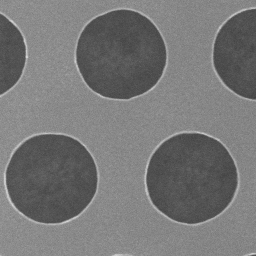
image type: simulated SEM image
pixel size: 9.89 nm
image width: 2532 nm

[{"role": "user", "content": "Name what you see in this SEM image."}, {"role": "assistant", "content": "holes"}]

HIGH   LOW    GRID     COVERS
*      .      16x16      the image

****************
.*****....****..
.****.....***...
..***.....***...
.****.....****..
.*****...*****..
****************
****************
**..*******..***
*.....****....**
......***......*
......***......*
*.....***.....**
**...*****...***
****************
****************